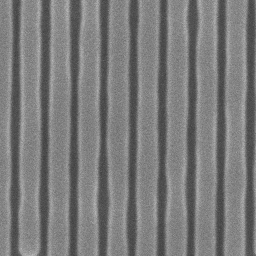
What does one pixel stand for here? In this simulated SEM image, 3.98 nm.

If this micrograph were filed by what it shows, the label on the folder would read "groups of lines, slits or small figures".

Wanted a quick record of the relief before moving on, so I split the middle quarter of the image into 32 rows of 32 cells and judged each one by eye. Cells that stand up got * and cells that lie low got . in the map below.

*...*****..*****...****...*****.
*...*****..*****...****...*****.
*...*****..*****...****...*****.
*...*****..*****...****...*****.
**..*****..*****...****...*****.
**..*****..*****...****...*****.
**..*****..*****...****...*****.
**..*****..*****...****...*****.
**..****...*****...****...*****.
*...****...*****...****...*****.
*...****...*****...****...*****.
*...*****..*****...****...*****.
*...*****..*****...****...*****.
*...*****..*****...****...*****.
*...*****..*****...****...*****.
*...*****..*****...****...*****.
*...*****..*****...****...*****.
*...*****..*****...****...****..
*...*****..*****...****...****..
*...*****..*****...****...****..
*...*****..*****...****...****..
*...*****..*****...****...*****.
*...*****..*****...****...*****.
*...****...*****...****...*****.
*...****...*****...****...*****.
*...****...*****...****...****..
*...****...*****...****...****..
*...****...*****..*****...****..
*...****...*****..*****...****..
*...****...*****..*****...****..
*...****...*****..*****...****..
*...****....****..*****...****..